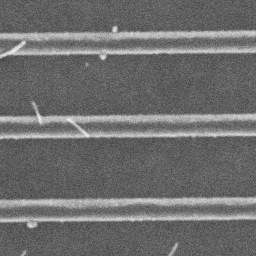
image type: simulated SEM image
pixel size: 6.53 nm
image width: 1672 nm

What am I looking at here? lines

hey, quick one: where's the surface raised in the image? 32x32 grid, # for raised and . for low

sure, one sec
................................
................................
................................
................................
################################
################################
######################..........
................................
................................
................................
................................
................................
................................
................................
...............................#
################################
################################
................................
................................
................................
................................
................................
................................
................................
................................
################################
################################
#########.......................
................................
................................
................................
................................